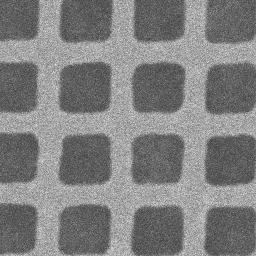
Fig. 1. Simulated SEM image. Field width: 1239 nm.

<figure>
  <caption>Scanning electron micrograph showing holes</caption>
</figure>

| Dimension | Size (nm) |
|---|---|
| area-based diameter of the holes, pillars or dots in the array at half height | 273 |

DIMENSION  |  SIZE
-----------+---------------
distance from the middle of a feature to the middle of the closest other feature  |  347 nanometers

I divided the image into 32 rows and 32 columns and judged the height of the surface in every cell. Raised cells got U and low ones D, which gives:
DDDDDUUUDDDDDDUUUDDDDDDUUUDDDDDD
DDDDDUUUDDDDDDUUUDDDDDDUUUDDDDDD
DDDDDUUDDDDDDDUUUDDDDDDUUUDDDDDD
DDDDDUUDDDDDDDUUUDDDDDDUUUDDDDDD
DDDDDUUUDDDDDDUUUDDDDDDUUUDDDDDD
UUUUUUUUUUUUUUUUUUUUUUUUUUUDDDUU
UUUUUUUUUUUUUUUUUUUUUUUUUUUUUUUU
UUUUUUUUUUUUUUUUUUUUUUUUUUUUUUUU
DDDDDUUUDDDDDDUUUDDDDDDUUUDDDDDD
DDDDDUUDDDDDDDUUDDDDDDDUUUDDDDDD
DDDDDUUDDDDDDDUUDDDDDDDUUUDDDDDD
DDDDDUUDDDDDDDUUUDDDDDDUUUDDDDDD
DDDDDUUDDDDDDDUUUDDDDDDUUUDDDDDD
DDDDUUUUDDDDDDUUUDDDDDDUUUDDDDDD
UUUUUUUUUUUUUUUUUUUUUUUUUUUUUUUU
UUUUUUUUUUUUUUUUUUUUUUUUUUUUUUUU
UUDDUUUUUUUUUUUUUUUUUUUUUUUUUUUU
DDDDDUUUDDDDDDUUUDDDDDDUUUDDDDDD
DDDDDUUUDDDDDDUUDDDDDDDUUUDDDDDD
DDDDDUUUDDDDDDUUUDDDDDDUUUDDDDDD
DDDDDUUDDDDDDDUUUDDDDDDUUUDDDDDD
DDDDDUUDDDDDDDUUDDDDDDDUUUDDDDDD
DDDDUUUDDDDDDDUUUDDDDDDUUUDDDDDD
UUUUUUUUUUUUUUUUUUUUUUUUUUUUUUUU
UUUUUUUUUUUUUUUUUUUUUUUUUUUUUUUU
DDUUUUUUUUDDUUUUUUUUUUUUUUUUUUUU
DDDDDUUUDDDDDDUUUDDDDDDUUUDDDDDD
DDDDDUUDDDDDDDUUUDDDDDDUUUDDDDDD
DDDDDUUDDDDDDDUUUDDDDDDUUUDDDDDD
DDDDDUUDDDDDDDUUDDDDDDDUUUDDDDDD
DDDDDUUDDDDDDDUUDDDDDDDUUDDDDDDD
DDDDUUUUDDDDDUUUUDDDDDDUUUDDDDDD